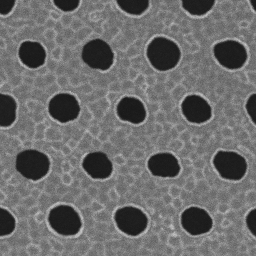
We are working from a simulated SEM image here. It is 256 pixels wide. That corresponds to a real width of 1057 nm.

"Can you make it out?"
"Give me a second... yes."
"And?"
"a regular array of holes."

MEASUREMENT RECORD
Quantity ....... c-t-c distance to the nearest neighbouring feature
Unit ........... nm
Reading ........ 265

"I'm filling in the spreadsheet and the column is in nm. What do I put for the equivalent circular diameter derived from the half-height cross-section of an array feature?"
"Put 124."